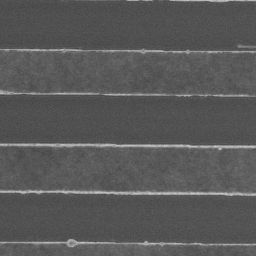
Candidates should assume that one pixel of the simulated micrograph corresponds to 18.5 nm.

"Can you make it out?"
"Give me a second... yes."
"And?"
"lines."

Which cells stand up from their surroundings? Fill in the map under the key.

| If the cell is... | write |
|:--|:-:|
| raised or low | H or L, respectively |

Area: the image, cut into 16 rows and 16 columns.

LLLLLLLLLLLLLLLL
LLLLLLLLLLLLLLLL
LLLLLLLLLLLLLLLL
HHHHHHHHHHHHHHHH
HHHHHHHHHHHHHHHH
HHHHHHHHHHHHHHHH
LLLLLLLLLLLLLLLL
LLLLLLLLLLLLLLLL
LLLLLLLLLLLLLLLL
HHHHHHHHHHHHHHHH
HHHHHHHHHHHHHHHH
HHHHHHHHHHHHHHHH
LLLLLLLLLLLLLLLL
LLLLLLLLLLLLLLLL
LLLLLLLLLLLLLLLL
HHHHHHHHHHHHHHHH